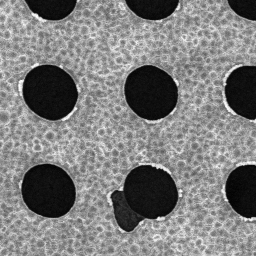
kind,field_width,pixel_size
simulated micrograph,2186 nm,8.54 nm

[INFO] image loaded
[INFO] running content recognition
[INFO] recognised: holes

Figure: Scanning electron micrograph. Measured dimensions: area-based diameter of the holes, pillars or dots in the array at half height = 470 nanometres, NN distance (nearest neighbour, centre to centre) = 97.4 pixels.